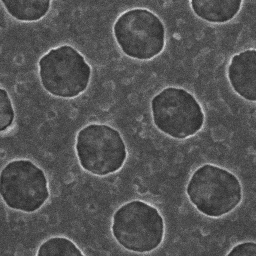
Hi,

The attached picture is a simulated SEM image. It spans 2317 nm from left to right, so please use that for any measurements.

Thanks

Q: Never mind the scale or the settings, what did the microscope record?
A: holes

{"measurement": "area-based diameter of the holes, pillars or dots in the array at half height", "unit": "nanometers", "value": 458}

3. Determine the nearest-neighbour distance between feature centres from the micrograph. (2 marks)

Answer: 0.766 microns